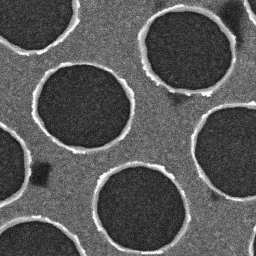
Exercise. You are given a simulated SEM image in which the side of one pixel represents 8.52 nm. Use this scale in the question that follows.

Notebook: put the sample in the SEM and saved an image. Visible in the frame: holes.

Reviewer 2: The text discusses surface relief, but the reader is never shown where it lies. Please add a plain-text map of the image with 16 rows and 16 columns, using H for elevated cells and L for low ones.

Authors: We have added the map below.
LLLLLHHHHHHHHHHH
LLLLHHHHHLLLLLHH
LLLLHHHHHLLLLLHH
HHHHHHHHHLLLLLLH
HHHLLLLHHHLLLLHH
HHHLLLLLHHHLLHHH
HHLLLLLLHHHHHHHH
HHLLLLLLHHHHHLLL
LHHLLLLHHHHHLLLL
LLHHHHHHHHHHLLLL
LLHHHHHHLLHHHLLL
LHHHHHLLLLLHHLLL
HHHHHHLLLLLLHHHH
HHHHHHLLLLLLHHHH
LLLLHHHLLLLHHHHH
LLLLLHHHLLHHHHHH